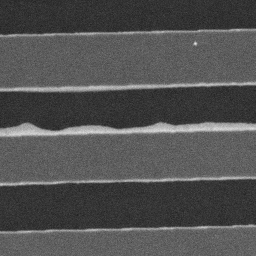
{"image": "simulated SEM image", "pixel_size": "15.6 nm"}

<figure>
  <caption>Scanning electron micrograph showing lines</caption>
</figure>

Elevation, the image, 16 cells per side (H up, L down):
LLLLLLLLLLLLLLLL
LLLLLLLLLLLLLLLL
HHHHHHHHHHHHHHHH
HHHHHHHHHHHHHHHH
HHHHHHHHHHHHHHHH
HHHHHLLLLLLLLLLL
LLLLLLLLLLLLLLLL
LLLLLLLLLLLLLLLL
HHHHHHHHHHHHHHHH
HHHHHHHHHHHHHHHH
HHHHHHHHHHHHHHHH
HLLLLLLLLLLLLLLL
LLLLLLLLLLLLLLLL
LLLLLLLLLLLLLLLL
LHHHHHHHHHHHHHHH
HHHHHHHHHHHHHHHH